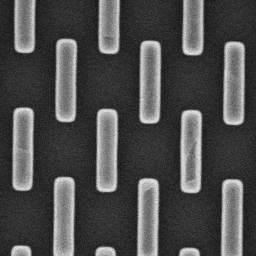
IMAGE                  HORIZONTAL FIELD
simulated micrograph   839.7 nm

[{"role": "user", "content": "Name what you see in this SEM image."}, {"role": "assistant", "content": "groups of lines, slits or small figures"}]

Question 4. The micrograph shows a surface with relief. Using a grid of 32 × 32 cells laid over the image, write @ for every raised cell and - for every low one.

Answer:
--@@---------@@--------@@-------
--@@---------@@--------@@-------
--@@---------@@--------@@-------
--@@---------@@--------@@-------
--@@---------@@--------@@-------
--@@---@@----@@---@@---@@----@--
-------@@----@----@@---@@---@@--
-------@@---------@@--------@@--
-------@@---------@@--------@@--
-------@@---------@@--------@@--
-------@@---------@@--------@@--
-------@@---------@@--------@@--
-------@@---------@@--------@@--
-------@@---------@@--------@@--
--@@---@@---@@----@@---@@---@@--
--@@--------@@@--------@@-------
--@@--------@@@--------@@-------
--@@--------@@---------@@-------
--@@--------@@---------@@-------
--@@--------@@---------@@-------
--@@--------@@---------@@-------
--@@--------@@---------@@-------
--@@---@@---@@---------@@-------
--@@---@@---@@---@@@---@@---@@--
-------@@--------@@@--------@@--
-------@@--------@@@--------@@--
-------@@--------@@@--------@@--
-------@@--------@@@--------@@--
-------@@--------@@@--------@@--
-------@@--------@@---------@@--
-------@@--------@@---------@@--
--@@---@@---@@---@@----@----@@--